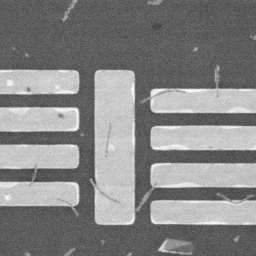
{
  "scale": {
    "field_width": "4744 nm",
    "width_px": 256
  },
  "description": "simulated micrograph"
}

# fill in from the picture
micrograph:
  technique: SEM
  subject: groups of lines, slits or small figures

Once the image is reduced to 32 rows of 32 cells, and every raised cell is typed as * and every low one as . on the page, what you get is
................................
................................
................................
................................
................................
................................
................................
................................
................................
**********..*****...............
**********..*****...............
*********...*****...************
............*****..*************
*..****.....*****..*************
**********..*****...............
**********..*****...............
............*****..*************
............*****..*************
**********..*****......*********
**********..*****...............
**********..*****...............
............*****..*************
............*****..*************
**********..*****...............
**********..*****...............
*********...*****..*************
............*****..*************
............*****..*************
................................
................................
.....................*..........
.....................**.........